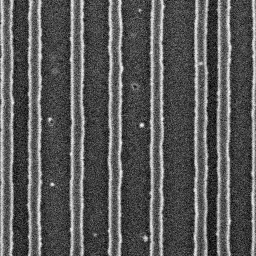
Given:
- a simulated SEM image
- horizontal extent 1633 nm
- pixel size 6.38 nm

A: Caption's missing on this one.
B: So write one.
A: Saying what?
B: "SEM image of lines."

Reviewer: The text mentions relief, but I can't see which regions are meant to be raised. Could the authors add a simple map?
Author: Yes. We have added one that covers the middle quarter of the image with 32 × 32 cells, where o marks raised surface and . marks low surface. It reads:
..ooo.......ooo.......ooo.......
..ooo.......ooo.......ooo.......
..ooo......ooo........oo........
..ooo......ooo........ooo.......
..ooo......ooo........oo........
..ooo......ooo........oo........
..oo.......ooo........oo........
..oo.......ooo........oo........
..oo.......ooo........oo........
..oo.......ooo........ooo.......
..ooo......ooo........oo........
..ooo......ooo........oo........
..ooo......ooo........ooo.......
..ooo......ooo........ooo.......
..ooo......ooo........oo........
..ooo......ooo........ooo.......
..ooo.......oo........ooo.......
..ooo.......oo........ooo.......
..ooo......ooo........ooo.......
..ooo......ooo........ooo.......
..ooo......ooo........oo........
..ooo......ooo........oo........
..ooo......ooo........oo........
..ooo......ooo........oo........
..ooo......ooo........ooo.......
..ooo......ooo........ooo.......
..ooo......ooo........ooo.......
..ooo......ooo........ooo.......
..ooo......ooo........ooo.......
..oo.......ooo........oo........
..oo.......ooo........oo........
..oo.......ooo........oo........